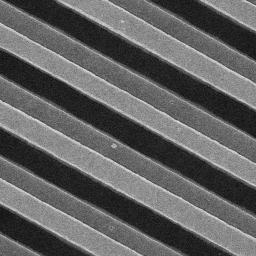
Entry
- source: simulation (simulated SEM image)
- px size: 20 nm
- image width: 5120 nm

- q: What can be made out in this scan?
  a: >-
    lines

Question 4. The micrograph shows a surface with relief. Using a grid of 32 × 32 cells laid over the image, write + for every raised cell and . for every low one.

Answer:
+.......+++++++++++.......++++++
+++.......+++++++++++.......++++
+++++.......+++++++++++......+++
+++++++......+++++++++++.......+
++++++++.......+++++++++++......
++++++++++.......+++++++++++....
.+++++++++++.......+++++++++++..
...+++++++++++.......++++++++++.
.....+++++++++++.......+++++++++
.......++++++++++.......++++++++
++.......++++++++++.......++++++
++++......+++++++++++.......++++
+++++.......+++++++++++.......++
+++++++.......+++++++++++.......
+++++++++.......++++++++++......
+++++++++++.......++++++++++....
.++++++++++++......+++++++++++..
...+++++++++++.......+++++++++++
.....+++++++++++.......+++++++++
.......+++++++++++.......+++++++
++.......+++++++++++.......+++++
+++.......++++++++++++.......+++
+++++.......+++++++++++.......++
+++++++.......+++++++++++.......
+++++++++.......+++++++++++.....
+++++++++++.......+++++++++++...
..+++++++++++.......+++++++++++.
....+++++++++++......+++++++++++
......+++++++++++......+++++++++
+......+++++++++++.......+++++++
++.......+++++++++++.......+++++
++++.......+++++++++++.......+++